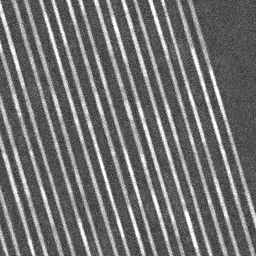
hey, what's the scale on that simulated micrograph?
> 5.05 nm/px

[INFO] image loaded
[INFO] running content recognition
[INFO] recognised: parallel lines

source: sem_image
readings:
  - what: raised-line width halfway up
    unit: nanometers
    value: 15.1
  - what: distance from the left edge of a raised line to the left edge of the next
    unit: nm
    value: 66.1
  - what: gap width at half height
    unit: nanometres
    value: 45.9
